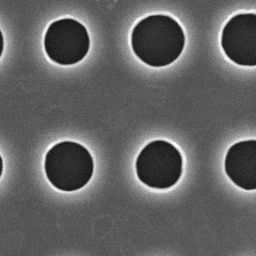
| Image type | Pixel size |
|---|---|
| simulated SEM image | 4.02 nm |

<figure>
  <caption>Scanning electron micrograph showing holes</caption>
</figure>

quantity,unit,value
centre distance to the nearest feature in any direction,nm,364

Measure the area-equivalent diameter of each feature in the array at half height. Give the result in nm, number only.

197